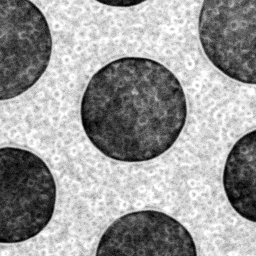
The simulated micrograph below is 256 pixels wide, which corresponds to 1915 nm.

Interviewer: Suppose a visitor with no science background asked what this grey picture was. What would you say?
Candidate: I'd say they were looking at holes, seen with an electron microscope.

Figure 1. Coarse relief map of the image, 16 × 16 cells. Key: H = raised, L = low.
LLHHHHHHHHHHHLLL
LLLHHHHHHHHHLLLL
LLLHHHHHHHHHLLLL
LLLHHHHHHHHHHLLL
LLLHHHLLLLLHHHLL
LLHHHLLLLLLHHHHH
HHHHHLLLLLLLHHHH
HHHHHLLLLLLLHHHH
HHHHHLLLLLLHHHHL
LLHHHHLLLLHHHHLL
LLLHHHHHHHHHHHLL
LLLHHHHHHHHHHHLL
LLLHHHHHHHHHHHLL
LLLHHHHHLLLHHHHL
LLLHHHHLLLLLHHHH
HHHHHHLLLLLLHHHH